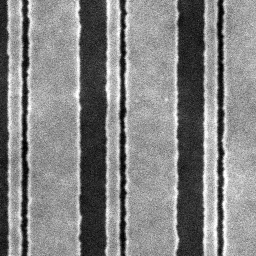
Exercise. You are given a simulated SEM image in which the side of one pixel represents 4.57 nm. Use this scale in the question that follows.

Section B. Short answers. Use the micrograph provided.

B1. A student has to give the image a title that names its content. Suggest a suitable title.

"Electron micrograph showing lines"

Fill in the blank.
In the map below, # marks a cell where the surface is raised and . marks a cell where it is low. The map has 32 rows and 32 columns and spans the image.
.#########...#########....######
.#########...#########....######
.#########...#########....######
.#########...#########....######
.#########...#########....######
.#########...#########....######
.#########...#########....######
.#########...#########....######
.#########...#########....######
.#########...#########....######
.#########...#########....######
.#########...#########....######
.#########...#########....######
.#########...#########....######
.#########...#########....######
.#########...#########....######
.#########...#########....######
.#########...#########....######
.#########...#########....######
.#########...#########....######
.#########...#########....######
.#########...#########...#######
.#########...#########...#######
.#########...#########....######
.#########...#########...#######
.#########...#########...#######
.#########...#########....######
.#########...#########....######
.#########...#########....######
.#########...#########....######
.#########...#########...#######
.#########...#########....######